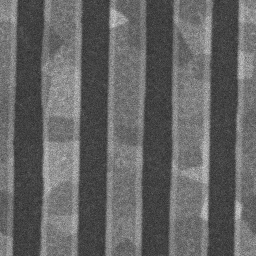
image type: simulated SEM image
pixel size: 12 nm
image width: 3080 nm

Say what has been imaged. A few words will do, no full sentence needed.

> one or a few lines or trenches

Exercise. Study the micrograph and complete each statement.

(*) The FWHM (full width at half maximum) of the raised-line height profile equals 377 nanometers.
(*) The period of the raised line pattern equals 778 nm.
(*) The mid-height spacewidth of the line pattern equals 398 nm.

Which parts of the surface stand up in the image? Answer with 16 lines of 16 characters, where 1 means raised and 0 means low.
1001100110011001
1001100110011001
1001100110011001
1001100110011001
1001100110011001
1001100110011001
1001100110011001
1001100110011001
1001100110011001
1001100110011001
1001100110011001
1001100110011001
1001100110011001
1001100110011001
1001100110011001
1001100110011001